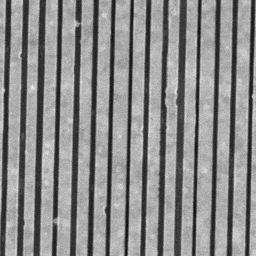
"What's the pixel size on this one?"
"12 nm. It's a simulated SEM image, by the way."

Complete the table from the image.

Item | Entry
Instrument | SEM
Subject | parallel lines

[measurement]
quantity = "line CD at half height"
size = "138 nm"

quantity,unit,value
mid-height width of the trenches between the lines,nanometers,69.1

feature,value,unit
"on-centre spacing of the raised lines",210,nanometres